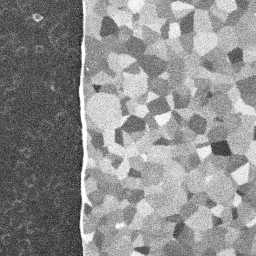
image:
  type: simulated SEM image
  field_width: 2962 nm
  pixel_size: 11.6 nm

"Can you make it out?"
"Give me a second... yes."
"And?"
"one or a few lines or trenches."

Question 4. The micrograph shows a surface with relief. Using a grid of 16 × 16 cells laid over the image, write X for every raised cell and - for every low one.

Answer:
-----XXXXXXXXXXX
-----XXXXXXXXXXX
-----XXXXXXXXXXX
-----XXXXXXXXXXX
-----XXXXXXXXXXX
-----XXXXXXXXXXX
-----XXXXXXXXXXX
-----XXXXXXXXXXX
-----XXXXXXXXXXX
-----XXXXXXXXXXX
-----XXXXXXXXXXX
-----XXXXXXXXXXX
-----XXXXXXXXXXX
-----XXXXXXXXXXX
-----XXXXXXXXXXX
-----XXXXXXXXXXX